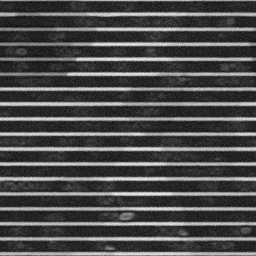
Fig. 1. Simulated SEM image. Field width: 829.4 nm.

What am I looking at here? parallel lines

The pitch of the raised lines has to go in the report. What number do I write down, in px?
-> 14.9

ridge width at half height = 8.9 nanometres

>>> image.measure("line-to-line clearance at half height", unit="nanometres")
37.6